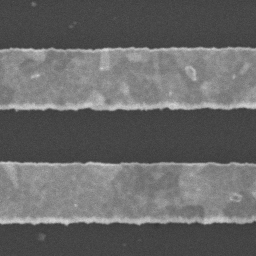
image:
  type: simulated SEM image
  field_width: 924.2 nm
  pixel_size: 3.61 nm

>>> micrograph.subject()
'lines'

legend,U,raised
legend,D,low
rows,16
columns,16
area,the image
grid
DDDDDDDDDDDDDDDD
DDDDDDDDDDDDDDDD
DDDDDDDDDDDDDDDD
UUUUUUUUUUUUUUUU
UUUUUUUUUUUUUUUU
UUUUUUUUUUUUUUUU
UUUUUUUUUUUUUUUU
DDDDDDDDDDDDDDDD
DDDDDDDDDDDDDDDD
DDDDDDDDDDDDDDDD
UUUUUUUUUUUUUUUU
UUUUUUUUUUUUUUUU
UUUUUUUUUUUUUUUU
UUUUUUUUUUUUUUUU
DDDDDDDDDDDDDDDD
DDDDDDDDDDDDDDDD